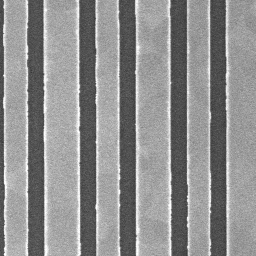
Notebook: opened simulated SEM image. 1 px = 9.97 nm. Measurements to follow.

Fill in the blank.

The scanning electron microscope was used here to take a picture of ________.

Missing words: lines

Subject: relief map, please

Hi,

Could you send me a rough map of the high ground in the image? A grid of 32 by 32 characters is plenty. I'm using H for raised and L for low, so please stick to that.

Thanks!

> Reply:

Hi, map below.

LHHLLLHHHHLLHHHLLHHHHLLHHHLLHHHH
LHHLLLHHHHLLHHHLLHHHHLLHHHLLHHHH
LHHLLLHHHHLLHHHLLHHHHLLHHHLLHHHH
HHHLLLHHHHLLHHHLLHHHHLLHHHLLHHHH
HHHLLLHHHHLLHHHLLHHHHLLHHHLLHHHH
HHHLLLHHHHLLHHHLLHHHHLLHHHLLHHHH
LHHLLLHHHHLLHHHLLHHHHLLHHHLLHHHH
LHHLLLHHHHLLHHHLLHHHHLLHHHLLHHHH
LHHLLLHHHHLLHHHLLHHHHLLHHHLLHHHH
LHHLLLHHHHLLHHHLLHHHHLLHHHLLHHHH
LHHLLLHHHHLLHHHLLHHHHLLHHHLLHHHH
LHHLLLHHHHLLHHHLLHHHHLLHHHLLHHHH
HHHLLLHHHHLLHHHLLHHHHLLHHHLLHHHH
HHHLLLHHHHLLHHHLLHHHHLLHHHLLHHHH
LHHLLLHHHHLLHHHLLHHHHLLHHHLLHHHH
LHHLLLHHHHLLHHHLLHHHHLLHHHLLHHHH
LHHLLLHHHHLLHHHLLHHHHLLHHHLLHHHH
LHHLLLHHHHLLHHHLLHHHHLLHHHLLHHHH
LHHLLLHHHHLLHHHLLHHHHLLHHHLLHHHH
LHHLLLHHHHLLHHHLLHHHHLLHHHLLHHHH
LHHLLLHHHHLLHHHLLHHHHLLHHHLLHHHH
LHHLLLHHHHLLHHHLLHHHHLLHHHLLHHHH
LHHLLLHHHHLLHHHLLHHHHLLHHHLLHHHH
LHHLLLHHHHLLHHHLLHHHHLLLHHLLHHHH
LHHLLLHHHHLLHHHLLHHHHLLHHHLLHHHH
LHHLLLHHHHLLHHHLLHHHHLLHHHLLHHHH
LHHLLLHHHHLLHHHLLHHHHLLLHHLLHHHH
LHHLLLHHHHLLHHHLLHHHHLLHHHLLHHHH
LHHLLLHHHHLLHHHLLHHHHLLHHHLLHHHH
LHHLLLHHHHLLHHHLLHHHHLLLHHLLHHHH
LHHLLLHHHHLLHHHLLHHHHLLLHHLLHHHH
LHHLLLHHHHLLHHHLLHHHHLLLHHLLHHHH